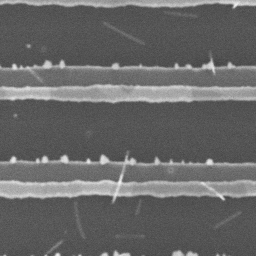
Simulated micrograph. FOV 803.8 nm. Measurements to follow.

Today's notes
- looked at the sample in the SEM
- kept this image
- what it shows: lines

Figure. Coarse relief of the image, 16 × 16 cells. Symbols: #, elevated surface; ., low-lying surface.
................
................
................
................
################
################
................
................
................
................
################
################
................
................
................
................